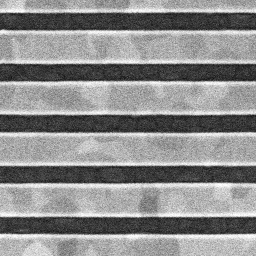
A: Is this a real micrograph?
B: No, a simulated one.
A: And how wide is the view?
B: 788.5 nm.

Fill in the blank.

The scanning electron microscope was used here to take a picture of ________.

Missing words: parallel lines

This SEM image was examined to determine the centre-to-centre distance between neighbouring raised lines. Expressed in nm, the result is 157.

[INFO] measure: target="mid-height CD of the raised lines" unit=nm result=94.4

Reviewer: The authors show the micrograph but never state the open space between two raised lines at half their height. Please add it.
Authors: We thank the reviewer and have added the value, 62.8 nm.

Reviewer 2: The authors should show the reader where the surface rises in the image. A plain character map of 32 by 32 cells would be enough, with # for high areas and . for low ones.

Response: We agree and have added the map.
################################
................................
................................
................................
################################
################################
################################
################################
................................
................................
################################
################################
################################
################################
................................
................................
................................
################################
################################
################################
################################
................................
................................
################################
################################
################################
################################
................................
................................
##..##..........................
################################
################################